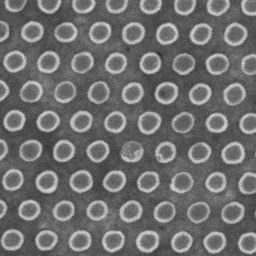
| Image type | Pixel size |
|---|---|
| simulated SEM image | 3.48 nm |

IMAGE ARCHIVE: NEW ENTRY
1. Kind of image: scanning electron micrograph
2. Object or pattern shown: a regular array of raised bodies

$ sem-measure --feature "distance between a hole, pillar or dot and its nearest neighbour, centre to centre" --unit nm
117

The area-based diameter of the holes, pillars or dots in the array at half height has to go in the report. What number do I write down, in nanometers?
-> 73.8